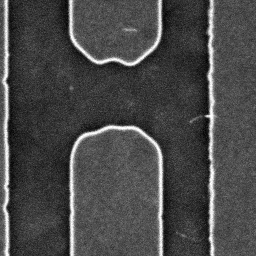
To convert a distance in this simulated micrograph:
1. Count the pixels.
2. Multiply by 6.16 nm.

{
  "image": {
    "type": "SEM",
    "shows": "one or a few lines or trenches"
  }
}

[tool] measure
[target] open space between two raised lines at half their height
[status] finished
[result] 395 nm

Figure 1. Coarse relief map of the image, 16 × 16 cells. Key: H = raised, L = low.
LLLLHHHHHHLLLHHH
LLLLHHHHHHLLLHHH
LLLLLHHHHHLLLHHH
LLLLLHHHHLLLLHHH
LLLLLLLLLLLLLHHH
LLLLLLLLLLLLLHHH
LLLLLLLLLLLLLHHH
LLLLLLLLLLLLLHHH
LLLLLHHHHLLLLHHH
LLLLLHHHHHLLLHHH
LLLLHHHHHHLLLHHH
LLLLHHHHHHLLLHHH
LLLLHHHHHHLLLHHH
LLLLHHHHHHLLLHHH
LLLLLHHHHHLLLHHH
LLLLLHHHHHLLLHHH